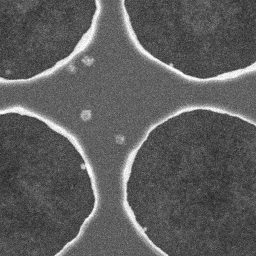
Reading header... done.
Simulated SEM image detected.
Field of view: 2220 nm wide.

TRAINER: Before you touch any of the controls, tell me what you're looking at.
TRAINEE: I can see holes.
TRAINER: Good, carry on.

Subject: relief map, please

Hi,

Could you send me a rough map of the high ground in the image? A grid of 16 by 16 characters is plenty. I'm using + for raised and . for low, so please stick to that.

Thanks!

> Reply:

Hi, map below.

......++........
......++........
.....++++.......
....++++++......
...++++++++....+
++++++++++++++++
++++++++++++++++
...+++++++.....+
....+++++.......
.....+++........
.....+++........
......++........
......++........
......++........
.....++++.......
....++++++......